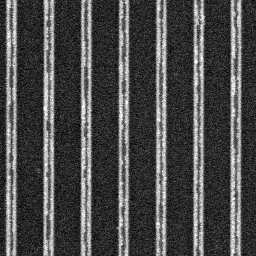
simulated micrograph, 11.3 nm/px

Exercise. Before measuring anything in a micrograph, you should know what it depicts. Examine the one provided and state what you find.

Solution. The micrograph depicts parallel lines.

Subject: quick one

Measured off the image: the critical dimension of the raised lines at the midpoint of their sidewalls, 0.0887 microns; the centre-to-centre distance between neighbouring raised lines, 422 nm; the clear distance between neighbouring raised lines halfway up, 332 nanometres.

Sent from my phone